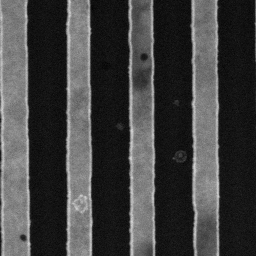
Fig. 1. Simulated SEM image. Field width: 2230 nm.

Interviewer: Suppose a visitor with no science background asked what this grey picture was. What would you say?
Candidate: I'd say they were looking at lines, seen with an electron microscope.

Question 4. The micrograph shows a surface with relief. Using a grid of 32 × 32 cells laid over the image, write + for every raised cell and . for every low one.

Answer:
+++......++.....+++.....+++.....
+++......++.....+++.....+++.....
+++.....+++.....+++.....+++.....
+++.....+++.....+++.....+++.....
+++.....+++.....+++.....+++.....
+++.....+++.....+++.....+++.....
+++......++.....+++.....+++.....
+++.....+++.....+++.....+++.....
+++.....+++.....+++.....+++.....
+++.....+++.....+++.....+++.....
+++.....+++.....+++.....+++.....
+++.....+++.....+++.....+++.....
+++.....+++.....+++.....+++.....
++++....+++.....+++.....+++.....
++++....+++.....+++.....+++.....
+++.....+++.....+++.....+++.....
+++.....+++.....+++.....+++.....
++++....+++.....+++.....+++.....
++++....+++.....+++.....+++.....
++++....+++.....+++.....+++.....
++++....+++.....+++.....+++.....
++++....+++.....+++.....+++.....
++++....+++.....+++.....+++.....
++++.....++.....+++.....+++.....
++++.....++.....+++.....+++.....
++++.....++.....+++.....+++.....
++++....+++.....+++.....+++.....
++++....+++.....+++.....+++.....
++++....+++.....+++.....+++.....
++++....+++.....+++.....+++.....
++++....+++.....+++.....+++.....
++++....+++.....+++.....+++.....